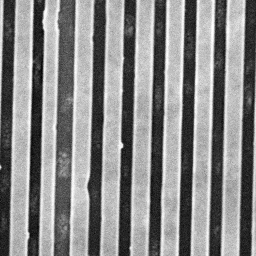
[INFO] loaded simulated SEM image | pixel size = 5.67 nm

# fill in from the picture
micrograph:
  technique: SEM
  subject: parallel lines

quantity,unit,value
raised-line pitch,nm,171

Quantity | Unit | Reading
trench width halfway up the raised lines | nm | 68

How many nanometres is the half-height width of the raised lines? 102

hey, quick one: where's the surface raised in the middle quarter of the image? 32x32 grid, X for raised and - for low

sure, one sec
---XXXX---XXXXX---XXXX----XXXX--
---XXXX---XXXXX---XXXX---XXXXX--
---XXXX---XXXXX---XXXX---XXXXX--
---XXXX---XXXXX---XXXX---XXXXX--
---XXXX---XXXX----XXXX---XXXX---
---XXXX---XXXX----XXXX---XXXX---
---XXXX---XXXX----XXXX---XXXX---
---XXXX---XXXX----XXXX---XXXX---
---XXXX---XXXX----XXXX---XXXX---
---XXXX---XXXX----XXXX---XXXX---
---XXXX---XXXX----XXXX---XXXX---
---XXXX---XXXX----XXXX---XXXX---
---XXXX---XXXX----XXXX---XXXX---
--XXXXX---XXXX---XXXXX---XXXX---
--XXXXX---XXXX---XXXXX---XXXX---
--XXXXX---XXXX---XXXXX---XXXX---
--XXXXX---XXXX---XXXXX---XXXX---
--XXXXX---XXXX---XXXXX---XXXX---
--XXXXX---XXXX---XXXXX---XXXX---
--XXXXX---XXXX---XXXXX---XXXX---
--XXXXX---XXXXX--XXXXX---XXXX---
--XXXXX---XXXX---XXXXX---XXXX---
--XXXXX---XXXX---XXXXX---XXXX---
--XXXXX---XXXX---XXXXX---XXXX---
--XXXX----XXXX---XXXX----XXXX---
--XXXX----XXXX---XXXX----XXXX---
--XXXX----XXXX---XXXX----XXXX---
--XXXX----XXXX---XXXX----XXXX---
--XXXX----XXXX---XXXX----XXXX---
--XXXX----XXXX---XXXX----XXXX---
--XXXX----XXXX---XXXX----XXXX---
--XXXX----XXXX---XXXX----XXXX---